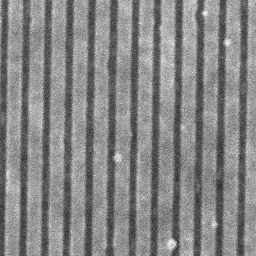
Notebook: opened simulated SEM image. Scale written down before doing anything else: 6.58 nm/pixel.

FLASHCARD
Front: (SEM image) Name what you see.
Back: parallel lines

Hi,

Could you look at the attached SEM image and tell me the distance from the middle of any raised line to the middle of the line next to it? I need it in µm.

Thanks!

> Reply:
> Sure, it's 0.143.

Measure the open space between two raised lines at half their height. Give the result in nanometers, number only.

53.4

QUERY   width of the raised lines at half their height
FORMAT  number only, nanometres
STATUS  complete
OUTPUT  88.8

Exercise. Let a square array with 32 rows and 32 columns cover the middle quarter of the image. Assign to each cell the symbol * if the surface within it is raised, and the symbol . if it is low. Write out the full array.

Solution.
..****..***...**...***..***...**
..****..***..***...***..***...**
..****..***..***...***..***...**
..****..***..***...***..***...**
..****..***..***...***..***...**
..****..***..***...***..***...**
..****..***..***...***..****..**
..***...***..***...***..****..**
..***...***..***...***..****..**
..***...***..***...***..****..**
..***...***..***...***..****..**
..***...***..***...***..****..**
..***...***..***...***..****..**
..***...***..***...***..***...**
..***...***..***...***..***...**
..***...***..***...***..***..***
..***...***..***...***..***..***
..***...***..****..***..***..***
..***...***..****..***..***..***
..***...***..***...***..***..***
..***...***..***...***..***..***
..***...***..***...***..***..***
..***...***..***...***..***..***
..***...***.****...***..***..***
..***...***..***...***..***..***
..***..****..***...***..***..***
..***..****..***...***..***..***
..***..****..***..****..***..***
..***..****..***..****..***..***
..***..****..***..****..***..***
..***..****..***..****..***..***
..***..****..***..****..***..***